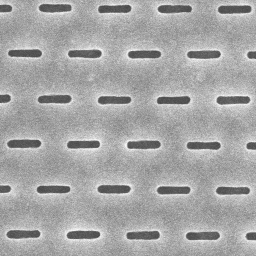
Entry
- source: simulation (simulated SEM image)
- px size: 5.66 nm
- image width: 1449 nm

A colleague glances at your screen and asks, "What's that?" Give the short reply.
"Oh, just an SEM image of a regular array of holes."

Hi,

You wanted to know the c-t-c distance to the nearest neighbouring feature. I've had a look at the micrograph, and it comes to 305 nm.